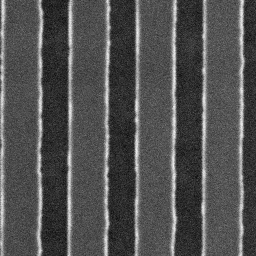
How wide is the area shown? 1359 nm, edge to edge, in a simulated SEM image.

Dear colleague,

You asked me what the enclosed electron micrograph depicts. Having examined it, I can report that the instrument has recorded lines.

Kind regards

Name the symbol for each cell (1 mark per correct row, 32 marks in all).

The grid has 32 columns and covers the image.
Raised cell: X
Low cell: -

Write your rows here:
XXXXX----XXXXX---XXXXX----XXXX--
XXXXX----XXXXX---XXXXX----XXXX--
XXXXX----XXXXX---XXXXX----XXXX--
XXXXX----XXXXX---XXXXX----XXXX--
XXXXX----XXXXX---XXXXX----XXXX--
XXXXX----XXXXX---XXXXX----XXXX--
XXXXX----XXXXX---XXXXX----XXXX--
XXXXX----XXXXX---XXXXX----XXXX--
XXXXX----XXXX----XXXXX---XXXXX--
XXXXX----XXXX----XXXXX---XXXXX--
XXXXX----XXXX----XXXXX----XXXX--
XXXXX----XXXX----XXXXX----XXXX--
XXXXX----XXXX----XXXXX---XXXXX--
XXXXX----XXXX----XXXXX---XXXXX--
XXXXX----XXXX----XXXXX---XXXXX--
XXXXX----XXXX----XXXXX---XXXXX--
XXXXX----XXXX----XXXXX---XXXXX--
XXXXX----XXXXX---XXXXX---XXXXX--
XXXXX----XXXX----XXXXX---XXXXX--
XXXXX----XXXX----XXXXX---XXXXX--
XXXXX----XXXX----XXXXX---XXXXX--
XXXXX----XXXX----XXXXX---XXXXX--
XXXXX----XXXX----XXXXX---XXXXX--
XXXXX----XXXX----XXXXX---XXXXX--
XXXXX----XXXX----XXXXX---XXXXX--
XXXXX----XXXX----XXXXX---XXXXX--
XXXXX----XXXX----XXXXX---XXXXX--
XXXXX----XXXXX---XXXXX---XXXXX--
XXXXX----XXXX----XXXXX---XXXXX--
XXXXX----XXXX----XXXXX---XXXXX--
XXXXX----XXXX----XXXXX---XXXXX--
XXXXX----XXXX----XXXXX---XXXXX--